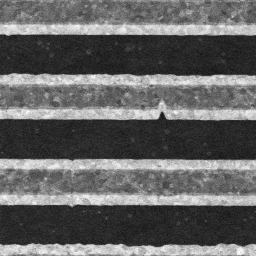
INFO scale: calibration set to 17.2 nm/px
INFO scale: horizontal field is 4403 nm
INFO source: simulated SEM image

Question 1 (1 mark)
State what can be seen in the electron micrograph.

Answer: one or a few lines or trenches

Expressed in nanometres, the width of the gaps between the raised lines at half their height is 882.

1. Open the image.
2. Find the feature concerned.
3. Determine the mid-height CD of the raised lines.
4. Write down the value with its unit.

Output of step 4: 576 nanometers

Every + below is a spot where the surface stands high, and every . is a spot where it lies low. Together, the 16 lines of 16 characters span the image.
++++++++++++++++
++++++++++++++++
................
................
................
++++++++++++++++
++++++++++++++++
................
................
................
++++++++++++++++
++++++++++++++++
................
................
................
................